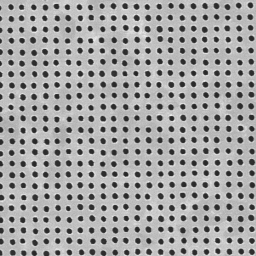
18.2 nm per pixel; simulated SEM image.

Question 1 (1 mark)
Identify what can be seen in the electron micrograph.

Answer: a regular array of holes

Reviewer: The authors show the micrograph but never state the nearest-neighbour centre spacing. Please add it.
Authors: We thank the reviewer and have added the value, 0.194 microns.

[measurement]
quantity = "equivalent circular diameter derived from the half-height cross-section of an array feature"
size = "0.107 microns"